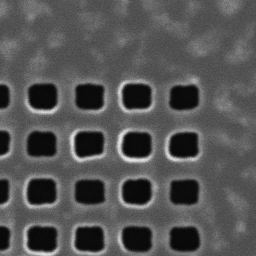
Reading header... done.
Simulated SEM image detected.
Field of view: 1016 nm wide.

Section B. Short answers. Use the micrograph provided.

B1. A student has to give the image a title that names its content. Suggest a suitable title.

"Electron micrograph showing a regular array of holes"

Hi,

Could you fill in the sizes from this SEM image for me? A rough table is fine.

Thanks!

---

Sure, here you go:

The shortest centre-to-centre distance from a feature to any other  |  187 nanometers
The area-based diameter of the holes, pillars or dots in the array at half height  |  119 nm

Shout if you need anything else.